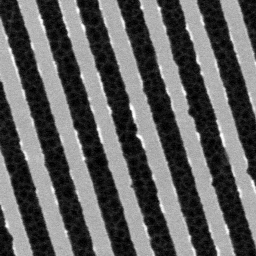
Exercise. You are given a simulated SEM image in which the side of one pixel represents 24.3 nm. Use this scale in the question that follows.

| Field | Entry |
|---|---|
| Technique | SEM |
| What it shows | parallel lines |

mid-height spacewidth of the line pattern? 532 nm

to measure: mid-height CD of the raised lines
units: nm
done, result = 401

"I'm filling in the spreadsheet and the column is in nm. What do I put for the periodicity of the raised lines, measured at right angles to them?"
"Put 939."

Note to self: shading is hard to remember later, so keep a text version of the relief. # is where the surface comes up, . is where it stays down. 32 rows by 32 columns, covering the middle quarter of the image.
##..####..##..####...#..####....
##..####..##..####......####....
....#####.##..#####.....#####...
...######......####......####...
..##.####.....#####......####...
.....#####.....#####.....#####..
......####......####......####..
......####......####......####..
......####......#####......###..
..##...####......####......####.
#.##...####.....#####..##..####.
#......#####.....####..##..####.
#......#####.....#####......###.
##......####.....#####......####
##......####......####......####
##......#####.....#####......###
###.....#####.....#####......###
###......####.....#####......###
###......####...#..#####.....###
####.....#####.....#####......##
####......####......####...#####
####......####......#####.....##
#####.....####.......####......#
.####...##.####......####......#
.####...##.####......#####.....#
.####....#.####......#####......
..####......####......####......
..####......####......#####.....
..#####.....####......#####.....
..#####......####......####.....
...####......####......####.....
##.####......####......#####....